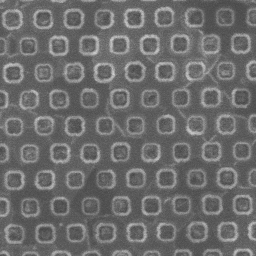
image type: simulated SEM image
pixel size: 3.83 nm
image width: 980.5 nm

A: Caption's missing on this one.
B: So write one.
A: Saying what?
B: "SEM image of a regular array of holes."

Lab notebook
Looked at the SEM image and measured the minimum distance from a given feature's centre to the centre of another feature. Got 30.1 pixels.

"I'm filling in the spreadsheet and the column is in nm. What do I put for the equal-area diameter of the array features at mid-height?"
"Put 62.4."